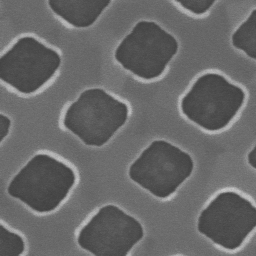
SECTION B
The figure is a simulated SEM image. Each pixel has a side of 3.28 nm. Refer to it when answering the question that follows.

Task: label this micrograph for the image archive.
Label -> holes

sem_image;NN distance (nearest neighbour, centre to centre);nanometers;275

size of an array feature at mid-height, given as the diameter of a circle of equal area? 0.183 um